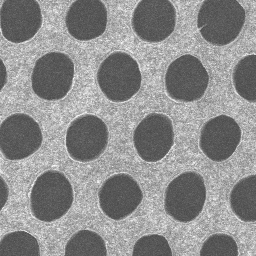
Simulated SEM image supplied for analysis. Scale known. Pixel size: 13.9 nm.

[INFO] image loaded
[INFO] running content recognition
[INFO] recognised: a regular array of holes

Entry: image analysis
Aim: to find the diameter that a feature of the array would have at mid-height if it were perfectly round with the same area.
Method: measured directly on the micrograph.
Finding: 624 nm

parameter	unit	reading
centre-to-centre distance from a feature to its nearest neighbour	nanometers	931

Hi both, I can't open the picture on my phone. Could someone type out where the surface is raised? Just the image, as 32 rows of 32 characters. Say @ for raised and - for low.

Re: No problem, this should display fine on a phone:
-----@@@@----@@@@----@@@@-----@@
-----@@@-----@@@@-----@@@------@
-----@@@-----@@@@-----@@@------@
-----@@@-----@@@@-----@@@-----@@
----@@@@@---@@@@@----@@@@-----@@
@@@@@@@@@@@@@@@@@@@@@@@@@@@-@@@@
@@@@@@@@@@@@@@@@@@@@@@@@@@@@@@@@
@@@@@----@@@@----@@@@@---@@@@@--
-@@@-----@@@-----@@@@-----@@@---
-@@@-----@@@------@@@-----@@@---
-@@@-----@@@------@@@-----@@@---
@@@@----@@@@@----@@@@-----@@@@--
@@@@@@-@@@@@@@--@@@@@@--@@@@@@@-
@@@@@@@@@@@@@@@@@@@@@@@@@@@@@@@@
@--@@@@@@@--@@@@@@--@@@@@@@-@@@@
-----@@@@----@@@@----@@@@@----@@
-----@@@-----@@@@-----@@@-----@@
-----@@@------@@@-----@@@-----@@
-----@@@-----@@@@----@@@@-----@@
@---@@@@@---@@@@@----@@@@@---@@@
@@@@@@@@@@@@@@@@@@@@@@@@@@@@@@@@
@@@@@@-@@@@@@@@@@@@@@@@-@@@@@@@@
@@@@@---@@@@@----@@@@@---@@@@@--
-@@@-----@@@@-----@@@-----@@@---
-@@@-----@@@------@@@-----@@@---
-@@@-----@@@-----@@@@----@@@@---
@@@@----@@@@@----@@@@----@@@@---
@@@@@--@@@@@@@@@@@@@@@--@@@@@@--
@@@@@@@@@@@@@@@@@@@@@@@@@@@@@@@@
@---@@@@@---@@@@@@@-@@@@@@---@@@
-----@@@-----@@@@----@@@@@---@@@
-----@@@-----@@@@----@@@@-----@@